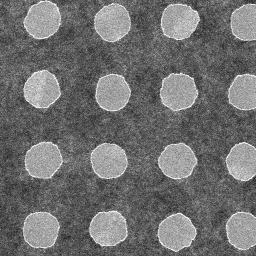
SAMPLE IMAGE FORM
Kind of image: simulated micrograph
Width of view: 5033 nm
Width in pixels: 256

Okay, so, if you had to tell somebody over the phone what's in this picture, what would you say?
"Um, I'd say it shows a regular array of raised bodies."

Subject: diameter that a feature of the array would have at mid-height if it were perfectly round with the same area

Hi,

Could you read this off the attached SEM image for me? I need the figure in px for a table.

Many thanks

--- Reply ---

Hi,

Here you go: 36.3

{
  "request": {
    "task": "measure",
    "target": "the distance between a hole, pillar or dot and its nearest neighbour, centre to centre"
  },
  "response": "67 px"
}